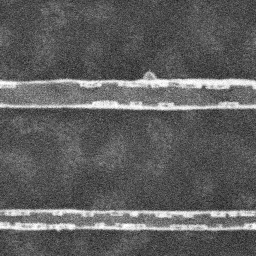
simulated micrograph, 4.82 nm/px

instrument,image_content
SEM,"one or a few lines or trenches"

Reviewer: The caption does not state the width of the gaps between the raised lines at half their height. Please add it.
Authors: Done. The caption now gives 503 nm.